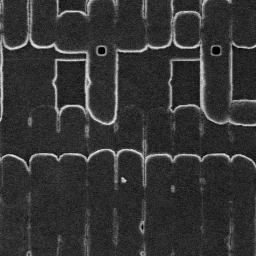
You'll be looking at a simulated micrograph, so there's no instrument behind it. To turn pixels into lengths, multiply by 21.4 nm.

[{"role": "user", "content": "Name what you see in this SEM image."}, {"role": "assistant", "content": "wiring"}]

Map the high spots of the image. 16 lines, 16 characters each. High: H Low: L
HHHHLHHHHHHLLHHH
HHHHHHHHHHHHHHHH
HHHHHHHHHHHHHHHH
LLLLLHHLLLLLLHLL
LLLLLHHLLLLLLHLL
LLLLLHHLLLLLLHLL
LLLLLHHLLLLLLHHH
LLLLLLHLLLLLLHHH
LLLLLLLLLLLLLLLL
LLLLLLHHHLLLLLLL
HHHHHHHHHHHHHHHH
HHHHHHHHHHHHHHHH
HHHHHHHHHHHHHHHH
HHHHHHHHHHHHHHHH
HHHHHHHHHHHHHHHH
HHHHHHHHHHHHHHHH